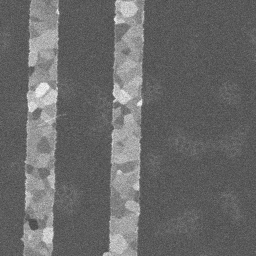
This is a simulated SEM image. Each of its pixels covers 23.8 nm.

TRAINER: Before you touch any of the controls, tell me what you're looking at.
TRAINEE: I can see one or a few lines or trenches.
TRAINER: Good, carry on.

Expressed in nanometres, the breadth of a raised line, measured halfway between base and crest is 656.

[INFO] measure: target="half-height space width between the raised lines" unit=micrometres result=1.35